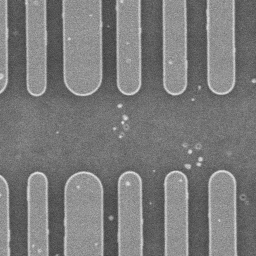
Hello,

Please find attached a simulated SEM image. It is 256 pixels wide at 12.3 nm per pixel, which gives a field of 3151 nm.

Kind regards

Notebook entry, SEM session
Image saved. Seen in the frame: groups of lines, slits or small figures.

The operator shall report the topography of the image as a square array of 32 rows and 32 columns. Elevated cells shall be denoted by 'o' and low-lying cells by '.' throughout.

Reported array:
o..ooo..ooooo..oo....oo...ooo...
o..ooo..ooooo..oo....oo...ooo...
o..ooo..ooooo..oo....oo...ooo...
o..ooo..ooooo..oo....oo...ooo...
o..ooo..ooooo..oo....oo...ooo...
o..ooo..ooooo..oo....oo...ooo...
o..ooo..ooooo..oo....oo...ooo...
o..ooo..ooooo..oo....oo...ooo...
o..ooo..ooooo..oo....oo...ooo...
o..ooo..ooooo..oo....oo...ooo...
o..ooo..oooo...oo....oo...ooo...
....o....ooo...oo....oo....o....
................................
................................
................................
................................
................................
................................
................................
................................
................................
...........................o....
o...oo...ooo...ooo...oo...ooo...
o...oo..ooooo..ooo...oo...ooo...
o...oo..ooooo..ooo...oo...ooo...
o...oo..ooooo..ooo...oo...ooo...
o...oo..ooooo..ooo...oo...ooo...
o...oo..ooooo..ooo...oo...ooo...
o...oo..ooooo..ooo...oo...ooo...
o...oo..ooooo..ooo...oo...ooo...
o...oo..ooooo..ooo...oo...ooo...
o...oo..ooooo..ooo...oo...ooo...